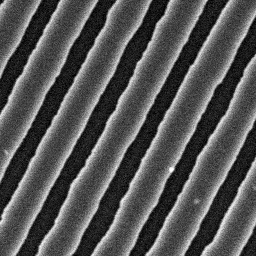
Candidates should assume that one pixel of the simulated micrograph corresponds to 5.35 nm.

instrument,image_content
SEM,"lines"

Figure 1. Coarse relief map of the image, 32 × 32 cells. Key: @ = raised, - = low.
@@@@@--@@@@@--@@@@@--@@@@@--@@@@
@@@@---@@@@---@@@@---@@@@---@@@@
@@@@--@@@@@--@@@@@--@@@@@--@@@@@
@@@---@@@@---@@@@--@@@@@---@@@@-
@@@--@@@@@--@@@@@--@@@@@--@@@@@-
@@---@@@@---@@@@---@@@@---@@@@--
@@--@@@@@--@@@@---@@@@@--@@@@@--
@---@@@@---@@@@---@@@@--@@@@@--@
@--@@@@@--@@@@---@@@@---@@@@@--@
--@@@@@---@@@@---@@@@--@@@@@--@@
--@@@@@--@@@@---@@@@---@@@@---@@
-@@@@@--@@@@@--@@@@@--@@@@@--@@@
-@@@@---@@@@---@@@@---@@@@---@@@
-@@@@---@@@@--@@@@@--@@@@@---@@@
@@@@---@@@@---@@@@---@@@@---@@@@
@@@@--@@@@@--@@@@@--@@@@@--@@@@@
@@@---@@@@---@@@@---@@@@---@@@@-
@@@--@@@@@--@@@@@--@@@@@--@@@@@-
@@---@@@@---@@@@---@@@@---@@@@--
@@--@@@@@--@@@@---@@@@@--@@@@@--
@---@@@@---@@@@---@@@@--@@@@@---
@--@@@@@--@@@@---@@@@---@@@@@--@
---@@@@--@@@@@---@@@@--@@@@@---@
--@@@@---@@@@---@@@@---@@@@---@@
--@@@@--@@@@@---@@@@--@@@@@---@@
-@@@@---@@@@---@@@@@--@@@@---@@@
@@@@@--@@@@@---@@@@--@@@@@--@@@@
@@@@---@@@@---@@@@---@@@@---@@@@
@@@@---@@@@---@@@@--@@@@@--@@@@@
@@@---@@@@---@@@@---@@@@---@@@@-
@@@--@@@@@--@@@@@--@@@@@--@@@@@-
@@---@@@@---@@@@---@@@@--@@@@@--